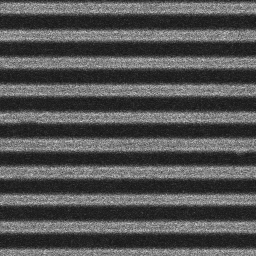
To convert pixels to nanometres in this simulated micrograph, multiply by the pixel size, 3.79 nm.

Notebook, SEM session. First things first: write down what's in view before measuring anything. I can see parallel lines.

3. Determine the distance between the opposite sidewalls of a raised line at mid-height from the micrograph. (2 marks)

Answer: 44.9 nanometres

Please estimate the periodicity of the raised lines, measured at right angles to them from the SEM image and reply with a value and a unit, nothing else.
104 nm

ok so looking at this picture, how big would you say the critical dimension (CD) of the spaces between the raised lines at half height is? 15.2 px